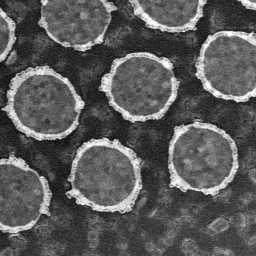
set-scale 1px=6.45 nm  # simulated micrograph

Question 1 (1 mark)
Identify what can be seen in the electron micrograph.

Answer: raised bodies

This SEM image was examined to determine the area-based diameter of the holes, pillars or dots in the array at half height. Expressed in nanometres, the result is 470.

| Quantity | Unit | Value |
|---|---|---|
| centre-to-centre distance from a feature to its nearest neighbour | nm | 612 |